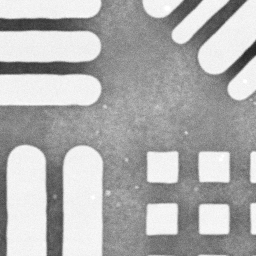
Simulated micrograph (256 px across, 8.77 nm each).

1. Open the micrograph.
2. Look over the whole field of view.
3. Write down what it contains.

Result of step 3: groups of lines, slits or small figures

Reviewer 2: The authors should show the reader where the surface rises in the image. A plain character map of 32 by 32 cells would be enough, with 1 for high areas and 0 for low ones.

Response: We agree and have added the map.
11111111111110000011110001110001
11111111111100000011100011100011
00000000000000000000000111000111
00000000000000000000001110001111
11111111111100000000001100011111
11111111111110000000000000111111
11111111111100000000000001111100
11111111111000000000000001111101
00000000000000000000000001110011
11111111111000000000000000000011
11111111111100000000000000000111
11111111111110000000000000000111
11111111111100000000000000000000
00000000000000000000000000000000
00000000000000000000000000000000
00000000000000000000000000000000
00000000000000000000000000000000
00000000000000000000000000000000
00110000011000000000000000000000
01111100111110000011110001111001
01111100111110000011110001111001
01111100111110000011110001111001
01111100111110000001110001111001
01111100111110000000000000000000
01111100111110000000000000000000
01111100111110000000110000000000
01111100111110000011110001111001
01111100111110000011110001111001
01111100111110000011110001111001
01111100111110000000000000000000
01111100111110000000000000000000
01111100111110000000000000000000